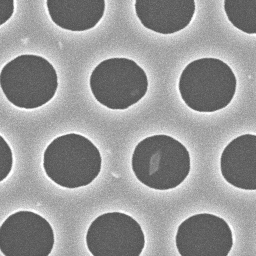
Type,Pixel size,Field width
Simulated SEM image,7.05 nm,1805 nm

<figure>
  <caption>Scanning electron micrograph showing holes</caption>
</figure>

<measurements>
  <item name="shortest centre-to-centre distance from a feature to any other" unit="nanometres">627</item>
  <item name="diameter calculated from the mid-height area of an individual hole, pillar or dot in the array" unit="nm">400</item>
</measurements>